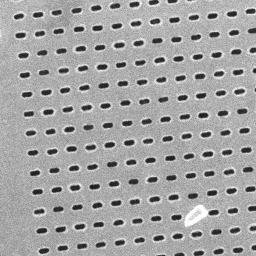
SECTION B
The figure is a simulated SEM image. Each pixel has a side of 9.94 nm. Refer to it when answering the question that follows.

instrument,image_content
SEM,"a regular array of holes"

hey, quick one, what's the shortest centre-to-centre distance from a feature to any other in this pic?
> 189 nm